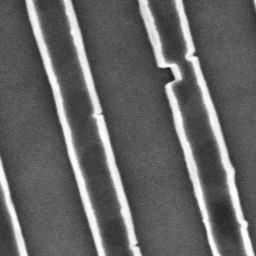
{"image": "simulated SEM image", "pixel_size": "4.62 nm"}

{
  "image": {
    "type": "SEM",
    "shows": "one or a few lines or trenches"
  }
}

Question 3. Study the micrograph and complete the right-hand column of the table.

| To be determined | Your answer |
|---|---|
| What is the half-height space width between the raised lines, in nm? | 343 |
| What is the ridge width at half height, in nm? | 162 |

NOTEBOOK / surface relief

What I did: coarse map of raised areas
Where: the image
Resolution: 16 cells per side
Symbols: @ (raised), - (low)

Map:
--@@-----@@-----
--@@@----@@@----
--@@@-----@@----
---@@-----@@----
---@@------@----
---@@@-----@@---
----@@-----@@---
----@@-----@@---
----@@@----@@@--
----@@@-----@@--
-----@@-----@@--
-----@@-----@@@-
-----@@@-----@@-
@-----@@-----@@-
@-----@@-----@@-
@-----@@-----@@@